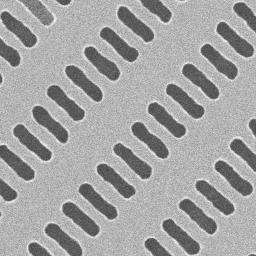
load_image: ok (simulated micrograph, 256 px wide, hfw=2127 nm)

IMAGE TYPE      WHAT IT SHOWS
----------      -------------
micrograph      a regular array of holes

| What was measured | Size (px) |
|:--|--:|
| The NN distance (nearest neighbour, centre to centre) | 26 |